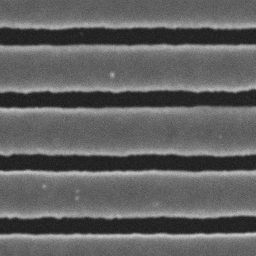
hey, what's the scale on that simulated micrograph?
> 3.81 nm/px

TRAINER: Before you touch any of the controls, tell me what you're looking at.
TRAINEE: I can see lines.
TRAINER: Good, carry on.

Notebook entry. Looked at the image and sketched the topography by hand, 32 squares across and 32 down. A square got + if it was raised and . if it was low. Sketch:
++++++++++++++++++++++++++++++++
++++++++++++++++++++++++++++++++
++++++++++++++++++++++++++++++++
......++........................
................................
................................
++++++++++++++++++++++++++++++++
++++++++++++++++++++++++++++++++
++++++++++++++++++++++++++++++++
++++++++++++++++++++++++++++++++
++++++++++++++++++++++++++++++++
................................
................................
................................
++++++++++++++++++++++++++++++++
++++++++++++++++++++++++++++++++
++++++++++++++++++++++++++++++++
++++++++++++++++++++++++++++++++
++++++++++++++++++++++++++++++++
................................
................................
++++..............++............
++++++++++++++++++++++++++++++++
++++++++++++++++++++++++++++++++
++++++++++++++++++++++++++++++++
++++++++++++++++++++++++++++++++
++++++++++++++++++++++++++++++++
................................
................................
++++++++++++++++++++++++++++++++
++++++++++++++++++++++++++++++++
++++++++++++++++++++++++++++++++